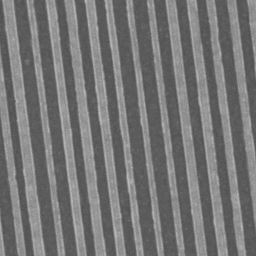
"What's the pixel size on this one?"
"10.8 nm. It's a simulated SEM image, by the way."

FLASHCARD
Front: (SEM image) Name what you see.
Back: parallel lines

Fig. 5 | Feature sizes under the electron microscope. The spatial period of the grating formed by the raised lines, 216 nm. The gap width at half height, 143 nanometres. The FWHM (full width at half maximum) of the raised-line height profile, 0.0724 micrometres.